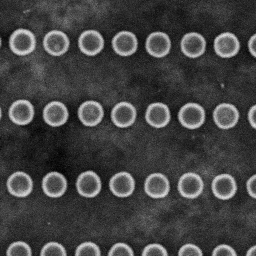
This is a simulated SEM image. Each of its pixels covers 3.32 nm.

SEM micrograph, a regular array of raised bodies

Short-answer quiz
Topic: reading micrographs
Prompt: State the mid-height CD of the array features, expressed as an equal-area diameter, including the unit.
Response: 77.7 nm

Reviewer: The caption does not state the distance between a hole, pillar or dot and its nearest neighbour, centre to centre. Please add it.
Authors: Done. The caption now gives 33.6 pixels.